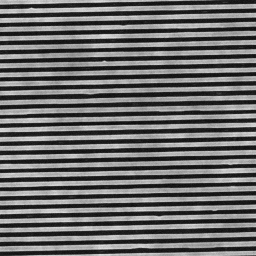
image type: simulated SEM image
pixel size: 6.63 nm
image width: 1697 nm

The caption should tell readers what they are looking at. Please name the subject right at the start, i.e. parallel lines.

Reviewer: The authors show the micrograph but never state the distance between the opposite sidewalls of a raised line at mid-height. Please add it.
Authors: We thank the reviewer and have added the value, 29.8 nm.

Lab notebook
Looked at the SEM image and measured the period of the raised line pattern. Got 60.6 nm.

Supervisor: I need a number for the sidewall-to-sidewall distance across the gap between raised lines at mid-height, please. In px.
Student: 4.49